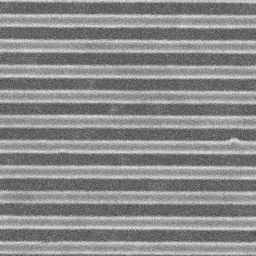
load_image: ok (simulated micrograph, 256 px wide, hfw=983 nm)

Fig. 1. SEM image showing parallel lines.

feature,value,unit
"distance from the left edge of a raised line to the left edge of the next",0.0967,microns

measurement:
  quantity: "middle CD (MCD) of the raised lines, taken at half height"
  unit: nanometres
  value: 41.2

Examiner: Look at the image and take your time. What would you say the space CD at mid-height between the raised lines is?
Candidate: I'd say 56.1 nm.